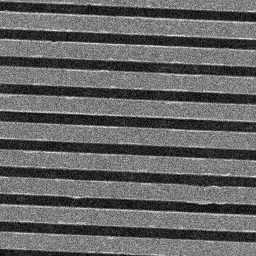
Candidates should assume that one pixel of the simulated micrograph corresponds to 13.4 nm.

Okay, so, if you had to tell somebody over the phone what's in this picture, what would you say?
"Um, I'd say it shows parallel lines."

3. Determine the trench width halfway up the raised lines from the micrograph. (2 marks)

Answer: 141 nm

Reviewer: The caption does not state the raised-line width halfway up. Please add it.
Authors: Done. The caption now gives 231 nm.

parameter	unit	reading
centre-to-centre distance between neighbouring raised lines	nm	369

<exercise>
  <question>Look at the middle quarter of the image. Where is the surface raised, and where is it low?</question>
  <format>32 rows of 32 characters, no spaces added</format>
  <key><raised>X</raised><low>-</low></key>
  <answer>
--------------------------------
XXXXXX---XX---------------------
XXXXXXXXXXXXXXXXXXXXXXXXXXXX----
XXXXXXXXXXXXXXXXXXXXXXXXXXXXXXXX
XXXXXXXXXXXXXXXXXXXXXXXXXXXXXXXX
XXXXXXXXXXXXXXXXXXXXXXXXXXXXXXXX
---------------------XXXXXXXXXXX
--------------------------------
XXXXXXX-------------------------
XXXXXXXXXXXXXXXXXXXXXXXXXXXXXX--
XXXXXXXXXXXXXXXXXXXXXXXXXXXXXXXX
XXXXXXXXXXXXXXXXXXXXXXXXXXXXXXXX
-----XXXXXXXXXXXXXXXXXXXXXXXXXXX
----------------------------XXXX
--------------------------------
XXXXXXXXX-----------------------
XXXXXXXXXXXXXXXXXXXXXXXXXXXXXXXX
XXXXXXXXXXXXXXXXXXXXXXXXXXXXXXXX
XXXXXXXXXXXXXXXXXXXXXXXXXXXXXXXX
----XXXXXXXXXXXXXXXXXXXXXXXXXXXX
--------------------------XXXXXX
--------------------------------
XXXXXXXXXX----------------------
XXXXXXXXXXXXXXXXXXXXXXXXXXXXXXXX
XXXXXXXXXXXXXXXXXXXXXXXXXXXXXXXX
XXXXXXXXXXXXXXXXXXXXXXXXXXXXXXXX
--------XXXXXXXXXXXXXXXXXXXXXXXX
-------------------------------X
--------------------------------
XXXXXXXXXXXX--------------------
XXXXXXXXXXXXXXXXXXXXXXXXXXXXXXX-
XXXXXXXXXXXXXXXXXXXXXXXXXXXXXXXX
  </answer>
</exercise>